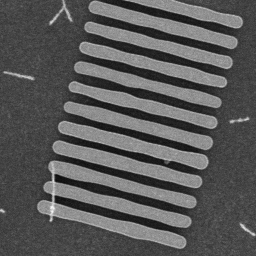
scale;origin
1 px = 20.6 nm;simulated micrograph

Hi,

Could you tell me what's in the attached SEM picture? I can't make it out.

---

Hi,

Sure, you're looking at groups of lines, slits or small figures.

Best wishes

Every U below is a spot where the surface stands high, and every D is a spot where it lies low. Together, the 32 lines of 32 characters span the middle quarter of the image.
DDDUUUUUUDDDDDDDDUUUUUUUUUUUUUDD
DDDUUUUUUUUUDDDDDDDDDDUUUUUUUUUU
DDDDDUUUUUUUUUUUUDDDDDDDDUUUUUUU
DDDDDDDDDUUUUUUUUUUUDDDDDDDDDUUU
DDDDDDDDDDDDDUUUUUUUUUUDDDDDDDDD
DUUUUUUDDDDDDDDDUUUUUUUUUUUUDDDD
DDUUUUUUUUUDDDDDDDDDDUUUUUUUUUUU
DDDDUUUUUUUUUUUUDDDDDDDDDUUUUUUU
DDDDDDDDUUUUUUUUUUDDDDDDDDDDUUUU
DUDDDDDDDDDUUUUUUUUUUUUDDDDDDDDU
UUUUUUDDDDDDDDUUUUUUUUUUUUDDDDDD
UUUUUUUUUUUDDDDDDDDUUUUUUUUUUUDD
DDDUUUUUUUUUUUUDDDDDDDDUUUUUUUUU
DDDDDDUUUUUUUUUUUDDDDDDDDDDUUUUU
UDDDDDDDDUUUUUUUUUUUUDDDDDDDDDDU
UUUUUUDDDDDDDDUUUUUUUUUUUUDDDDDD
UUUUUUUUUDDDDDDDDDUUUUUUUUUUUDDD
UUUUUUUUUUUUUDDDDDDDDUUUUUUUUUUU
DDDDUUUUUUUUUUUUUUDDDDDDDUUUUUUU
DDDDDDDDUUUUUUUUUUUUUDDDDDDDDUUU
UUUDDDDDDDDDUUUUUUUUUUUUUDDDDDDD
UUUUUUUUUDDDDDDDUUUUUUUUUUUUUDDD
UUUUUUUUUUUUUDDDDDDDUUUUUUUUUUUU
DDDUUUUUUUUUUUUUDDDDDDDUUUUUUUUU
DDDDDDDUUUUUUUUUUUUDDDDDDDDDDUUU
UUUUDDDDDDDUUUUUUUUUUUUUUDDDDDDD
UUUUUUUDDDDDDDDUUUUUUUUUUUUDDDDD
UUUUUUUUUUDDDDDDDDUUUUUUUUUUUUUD
DUUUUUUUUUUUUUDDDDDDDDDUUUUUUUUU
DDDDDDUUUUUUUUUUUUDDDDDDDDDUUUUU
UUDDDDDDDDDUUUUUUUUUUDDDDDDDDDUU
UUUUUUDDDDDDDDUUUUUUUUUUUUDDDDDD